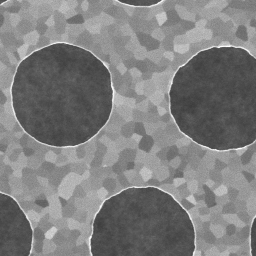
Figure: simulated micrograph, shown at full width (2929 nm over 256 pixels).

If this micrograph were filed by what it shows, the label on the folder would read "holes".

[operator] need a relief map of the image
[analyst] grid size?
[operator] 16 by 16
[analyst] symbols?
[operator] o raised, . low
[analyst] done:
oooooooooooooooo
oooooooooooooooo
oooooooooooooooo
oo....oooooo....
o......oooo.....
o......oooo.....
o......oooo.....
o......oooo.....
oo....oooooo....
oooooooooooooooo
oooooooooooooooo
oooooooooooooooo
.oooooo....ooooo
..oooo......oooo
..oooo......oooo
..oooo......oooo